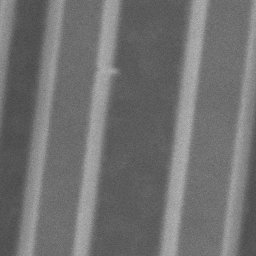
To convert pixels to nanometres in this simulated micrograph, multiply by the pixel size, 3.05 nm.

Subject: one or a few lines or trenches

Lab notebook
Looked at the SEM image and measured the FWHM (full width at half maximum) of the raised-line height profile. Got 169 nm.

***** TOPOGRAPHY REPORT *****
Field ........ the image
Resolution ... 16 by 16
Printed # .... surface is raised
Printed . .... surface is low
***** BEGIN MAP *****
....###.....####
...####.....####
...####.....####
...####.....####
...####.....####
...###......####
...###......###.
...###......###.
...###.....####.
..####.....####.
..####.....####.
..####.....####.
..###......####.
..###......####.
..###......###..
..###......###..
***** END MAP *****